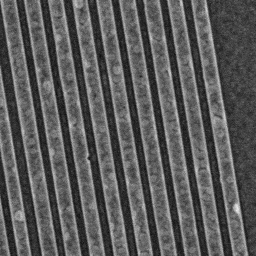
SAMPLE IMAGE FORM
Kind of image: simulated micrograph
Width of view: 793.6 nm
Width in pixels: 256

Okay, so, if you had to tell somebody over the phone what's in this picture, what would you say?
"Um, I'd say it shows parallel lines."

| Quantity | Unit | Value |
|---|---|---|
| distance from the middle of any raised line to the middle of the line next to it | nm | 73.1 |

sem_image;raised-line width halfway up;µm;0.0452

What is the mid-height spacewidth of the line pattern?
25.6 nm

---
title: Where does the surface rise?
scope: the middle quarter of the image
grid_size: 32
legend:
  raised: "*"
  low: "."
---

**...***...***...***...***...***
***..****..****..****..****..***
***..****..****..****..****..***
***..****..****..****..****..***
***..****..****..****..****..***
***...***...***..****..****..***
***...***...***...***...***...**
****..****..****..****..****..**
****..****..****..****..****..**
****..****..****..****..****..**
****..****..****..****..****..**
.***...***...***..****..****..**
.***...***...***...***...***...*
.****..****..****..****..****..*
.****..****..****..****..****..*
.*.**..****..****..****..****..*
.****..****..****..****..****..*
..***...***...***..****..****..*
..***...***...***...***...***...
..****..****..****..****..****..
..****..****..****..****..****..
..****..****..****..****..****..
..****..****..****..****..****..
...***...***...***..****..****..
*..***...***...***...***...***..
*..***...***...***...***...***..
*..****..****..****..****..****.
*..****..****..****..****..****.
*..****..****..****..****..****.
*...***...***...***..****..****.
*...***...***...***...***...***.
*...***...***...***...***...***.